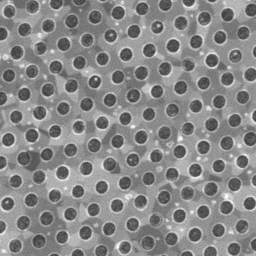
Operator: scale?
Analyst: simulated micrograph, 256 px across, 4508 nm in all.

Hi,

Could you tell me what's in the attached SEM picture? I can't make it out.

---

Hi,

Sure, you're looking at a regular array of holes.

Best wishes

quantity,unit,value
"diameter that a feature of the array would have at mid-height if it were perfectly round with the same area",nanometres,236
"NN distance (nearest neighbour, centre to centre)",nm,417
